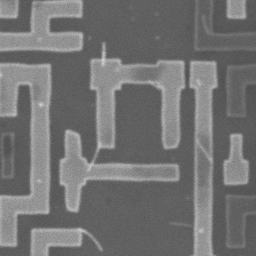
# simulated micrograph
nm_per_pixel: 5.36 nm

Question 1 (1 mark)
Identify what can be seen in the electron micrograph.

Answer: wiring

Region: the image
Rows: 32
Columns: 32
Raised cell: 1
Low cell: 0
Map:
11001111110000000000000011001110
11001111110000000000000011001110
00001100000000000000000011000000
00001100000000000000000011000000
11111111110000000000000011111111
11111111110000000000000011111111
00000000000000000000000000000000
00000000000011100000000000000000
11111100000111111111111011100111
11111100000111111111111011101111
11111100000111100001111011101110
11001100000011000000111011001110
11001100000011000000110011001110
11001100000011000000110011001110
11001100000011000000110011000100
00001100000011000000110011000000
00001100100011000000110011000000
11001100110011000000110011000100
11001100110000000000000011000100
11001100110000000000000011000100
11001100111101110000000011001110
11001100111111111111110011001110
00001100111000011111110011001110
00001100110000000000000011000000
00011100110000000000000011000100
11111100110000000000000011001111
11111100000000000000000011001111
11000000000000000000000011001110
11000000000000000000000011001110
11001111110000000000000011001110
11001111110000000000000011001110
00001100000000000000000011000000